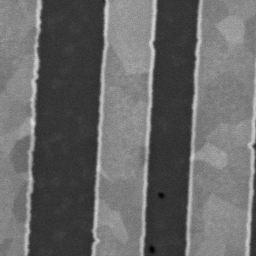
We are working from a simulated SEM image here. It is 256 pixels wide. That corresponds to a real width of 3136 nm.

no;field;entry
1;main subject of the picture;one or a few lines or trenches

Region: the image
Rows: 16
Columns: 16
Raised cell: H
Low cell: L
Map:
HHLLLLLHHHLLLHHH
HHLLLLLHHHLLHHHH
HHLLLLLHHHLLHHHH
HHLLLLLHHHLLHHHH
HHLLLLHHHLLLHHHH
HHLLLLHHHLLLHHHH
HHLLLLHHHLLLHHHH
HHLLLLHHHLLLHHHH
HHLLLLHHHLLLHHHH
HHLLLLHHHLLLHHHH
HHLLLLHHHLLLHHHH
HHLLLLHHHLLLHHHH
HHLLLLHHHLLLHHHH
HHLLLLHHHLLLHHHH
HHLLLLHHHLLLHHHH
HHLLLLHHHLLLHHHL